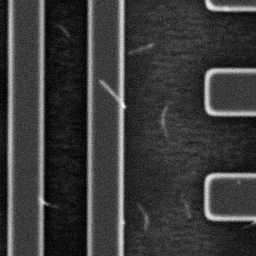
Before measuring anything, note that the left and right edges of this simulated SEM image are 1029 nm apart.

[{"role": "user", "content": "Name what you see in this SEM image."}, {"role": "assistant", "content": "groups of lines, slits or small figures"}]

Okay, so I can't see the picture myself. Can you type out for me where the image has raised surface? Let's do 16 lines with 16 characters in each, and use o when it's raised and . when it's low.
.oo...oo.....ooo
.oo...oo........
.oo...oo........
.oo...oo........
.oo...oo.....ooo
.oo...oo.....ooo
.oo...oo.....ooo
.oo...oo........
.oo...oo........
.oo...oo........
.oo...oo........
.oo...oo.....ooo
.oo...oo.....ooo
.oo...oo.....ooo
.oo...oo........
.oo...oo........